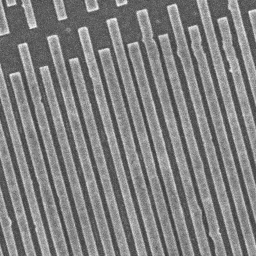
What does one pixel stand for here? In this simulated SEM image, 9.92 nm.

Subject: parallel lines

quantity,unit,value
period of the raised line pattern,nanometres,152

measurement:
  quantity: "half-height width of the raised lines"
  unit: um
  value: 0.0862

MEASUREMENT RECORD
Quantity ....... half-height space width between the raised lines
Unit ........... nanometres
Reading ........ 59.9